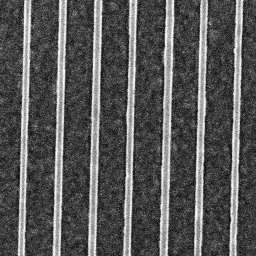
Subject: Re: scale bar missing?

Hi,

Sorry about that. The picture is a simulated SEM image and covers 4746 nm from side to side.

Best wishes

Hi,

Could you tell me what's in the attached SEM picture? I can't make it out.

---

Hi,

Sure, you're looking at parallel lines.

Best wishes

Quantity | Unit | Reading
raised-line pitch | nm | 654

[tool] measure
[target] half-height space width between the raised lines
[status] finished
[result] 29.2 px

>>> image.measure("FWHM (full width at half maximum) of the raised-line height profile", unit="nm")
109